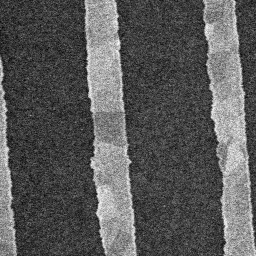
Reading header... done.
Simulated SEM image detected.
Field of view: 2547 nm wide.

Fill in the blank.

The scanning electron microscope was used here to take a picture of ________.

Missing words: one or a few lines or trenches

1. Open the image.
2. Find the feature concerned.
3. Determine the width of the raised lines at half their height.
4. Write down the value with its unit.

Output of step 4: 294 nanometres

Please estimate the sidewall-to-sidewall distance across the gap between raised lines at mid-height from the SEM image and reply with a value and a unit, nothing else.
891 nanometers